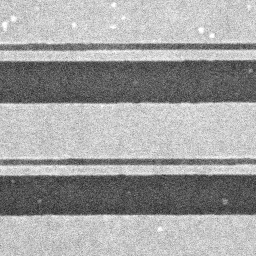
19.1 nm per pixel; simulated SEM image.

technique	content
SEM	lines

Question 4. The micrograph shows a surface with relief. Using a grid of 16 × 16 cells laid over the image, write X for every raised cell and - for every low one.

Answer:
XXXXXXXXXXXXXXXX
XXXXXXXXXXXXXXXX
XXXXXXXXXXXXXXXX
XXXXXXXXXXXXXXXX
----------------
----------------
-------------XXX
XXXXXXXXXXXXXXXX
XXXXXXXXXXXXXXXX
XXXXXXXXXXXXXXXX
XXXXXXXXXXXXXXXX
----------------
----------------
--XX-XXXXXXXXXXX
XXXXXXXXXXXXXXXX
XXXXXXXXXXXXXXXX